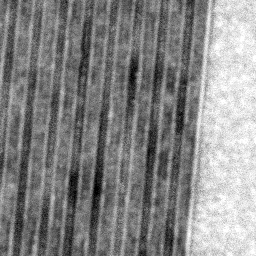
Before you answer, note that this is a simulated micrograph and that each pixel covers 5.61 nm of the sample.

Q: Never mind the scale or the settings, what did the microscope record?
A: parallel lines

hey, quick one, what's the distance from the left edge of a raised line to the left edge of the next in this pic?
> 141 nm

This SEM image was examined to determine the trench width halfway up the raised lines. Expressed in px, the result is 10.6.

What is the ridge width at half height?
14.4 pixels